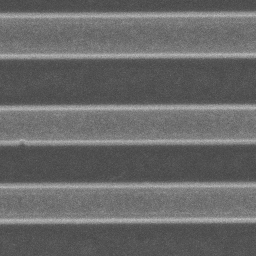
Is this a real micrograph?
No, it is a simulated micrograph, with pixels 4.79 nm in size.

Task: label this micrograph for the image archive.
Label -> one or a few lines or trenches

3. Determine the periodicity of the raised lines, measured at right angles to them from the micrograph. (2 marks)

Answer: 401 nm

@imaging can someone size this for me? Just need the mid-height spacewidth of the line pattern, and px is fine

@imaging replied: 46.7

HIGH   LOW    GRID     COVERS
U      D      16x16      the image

DDDDDDDDDDDDDDDD
UUUUUUUUUUUUUUUU
UUUUUUUUUUUUUUUU
UUUUUUDDDDDDDDDD
DDDDDDDDDDDDDDDD
DDDDDDDDDDDDDDDD
DDDDDDDDDDDDDDDD
UUUUUUUUUUUUUUUU
UUUUUUUUUUUUUUUU
DDDDDDDDDDDDDDDD
DDDDDDDDDDDDDDDD
DDDDDDDDDDDDDDDD
UUUUUUUUUUUUUUUU
UUUUUUUUUUUUUUUU
DDDDDDDDDDDDDDDD
DDDDDDDDDDDDDDDD